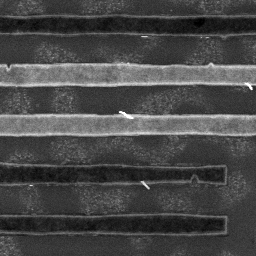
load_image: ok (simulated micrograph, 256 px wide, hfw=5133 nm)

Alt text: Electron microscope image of parallel lines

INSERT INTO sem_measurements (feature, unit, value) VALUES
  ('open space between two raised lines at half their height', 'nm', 632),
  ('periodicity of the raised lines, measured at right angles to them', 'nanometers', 1000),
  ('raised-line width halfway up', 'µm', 0.368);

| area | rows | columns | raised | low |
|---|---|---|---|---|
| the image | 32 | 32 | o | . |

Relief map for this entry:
................................
................................
oooooooooooooooooooooooooooooooo
oooooooooooooooooooooooooooooooo
...........................o....
................................
................................
................................
oooooooooooooooooooooooooooooooo
oooooooooooooooooooooooooooooooo
oooooooo.oooooo..............ooo
................................
................................
................................
oooooooo.oo....o............o...
oooooooooooooooooooooooooooooooo
oooooooooooooooooooooooooooooooo
................................
................................
................................
o...............................
oooooooooooooooooooooooooooo....
oooooooooooooooooooooooo.ooo....
................................
................................
................................
................................
oooooooooooooooooooooooooooo....
oooooooooooooooooooooooooooo....
................................
................................
................................